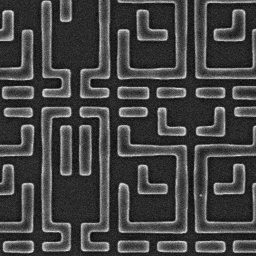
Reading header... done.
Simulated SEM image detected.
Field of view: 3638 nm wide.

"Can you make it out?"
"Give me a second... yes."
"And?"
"wiring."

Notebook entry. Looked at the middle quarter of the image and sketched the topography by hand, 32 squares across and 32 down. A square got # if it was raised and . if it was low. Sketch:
.........##..###............##..
#....######...################..
##..#######...################..
##..#######...################..
#...##..........................
#...###.........................
##..#######...#######..#######..
##..#######...#######..#######..
..............#######...........
................................
................................
##..#######...#######...#.......
##..#######...#######...#.......
.........##.............#.......
.........##.............#.......
.........##.............##......
##..###..##...##........######..
##..###..##...##........######..
##..###..##...##................
##..###..##...##................
##..###..##...#########.....##..
##..###..##...#################.
##..###..##...#################.
##..###..##.................###.
##..###..##.................###.
##..###..##........##.......###.
##..###..##........##.......###.
##..##...##........##.......###.
.........##........##.......###.
.........##........##.......###.
.........##...##...#######..###.
.........##...##...#######..###.